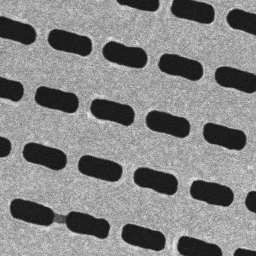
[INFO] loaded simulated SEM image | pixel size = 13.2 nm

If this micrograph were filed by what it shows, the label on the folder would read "a regular array of holes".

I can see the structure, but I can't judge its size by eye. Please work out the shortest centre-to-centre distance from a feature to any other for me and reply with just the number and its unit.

0.754 microns